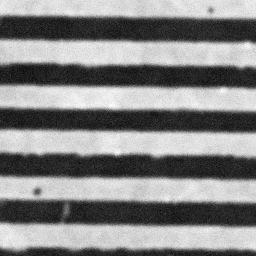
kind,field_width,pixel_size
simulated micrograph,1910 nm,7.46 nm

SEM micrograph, lines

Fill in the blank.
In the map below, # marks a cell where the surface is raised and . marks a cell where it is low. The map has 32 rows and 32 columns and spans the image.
################################
################################
................................
................................
................................
################################
################################
################################
................................
................................
................................
################################
################################
......##########################
................................
................................
########.##.....................
################################
################################
................................
................................
................................
###########################.....
################################
################################
................................
................................
................................
################################
################################
################################
................................